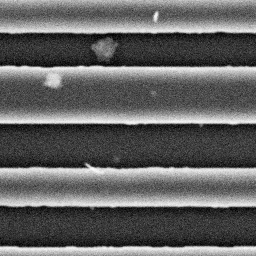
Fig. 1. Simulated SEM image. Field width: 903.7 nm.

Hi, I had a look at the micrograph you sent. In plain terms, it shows lines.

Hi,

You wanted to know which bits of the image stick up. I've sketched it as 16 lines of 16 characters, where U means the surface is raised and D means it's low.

UUUUUUUUUUUUUUUU
UUUUUUUUUUUUUUUU
DDDDDDDDDDDDDDDD
DDDDDDDDDDDDDDDD
UUUUUUUUUUUUUUUU
UUUUUUUUUUUUUUUU
UUUUUUUUUUUUUUUU
UUUUUUUUUUUUUUUU
DDDDDDDDDDDDDDDD
DDDDDDDDDDDDDDDD
DDDDDDDDDDDDDDDD
UUUUUUUUUUUUUUUU
UUUUUUUUUUUUUUUU
DDDDDDDDDDDDDDDD
DDDDDDDDDDDDDDDD
UDDDUDDUUUDUUUDU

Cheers